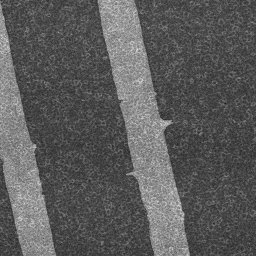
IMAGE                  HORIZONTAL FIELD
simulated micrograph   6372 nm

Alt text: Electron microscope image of one or a few lines or trenches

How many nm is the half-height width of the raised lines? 884